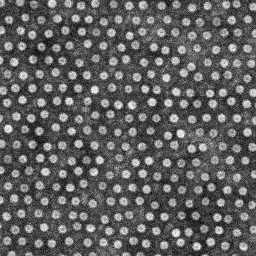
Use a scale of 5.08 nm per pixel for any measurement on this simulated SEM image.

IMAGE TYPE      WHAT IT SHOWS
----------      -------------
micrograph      a regular array of raised bodies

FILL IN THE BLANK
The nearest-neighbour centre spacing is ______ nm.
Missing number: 69.3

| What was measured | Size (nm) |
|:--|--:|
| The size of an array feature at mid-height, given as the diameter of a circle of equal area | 35.8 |